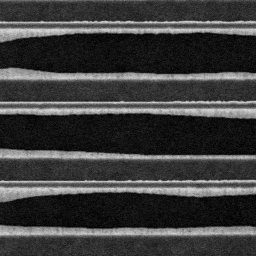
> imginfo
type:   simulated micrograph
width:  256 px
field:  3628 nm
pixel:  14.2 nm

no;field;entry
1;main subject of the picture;lines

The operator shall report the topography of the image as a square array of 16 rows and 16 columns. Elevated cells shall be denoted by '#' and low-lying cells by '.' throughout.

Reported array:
################
################
................
................
................
################
################
................
................
................
################
################
................
................
##...........###
################